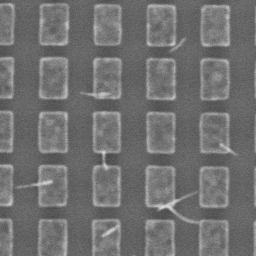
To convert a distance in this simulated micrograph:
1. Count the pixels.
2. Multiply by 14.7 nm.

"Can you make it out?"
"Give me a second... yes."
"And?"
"wiring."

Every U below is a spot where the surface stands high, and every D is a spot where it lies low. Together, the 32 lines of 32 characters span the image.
UDDDDDDUDDDDDDDDDDDDDDDDDDDDDDDD
UUDDDUUUDDDDUUUDDDUUUUDDDUUUUDDD
UUDDDUUUDDDDUUUDDDDUUUDDDUUUUDDD
UUDDDUUUDDDDUUUDDDDUUUDDDUUUUDDD
UUDDDUUUDDDDUUUDDDUUUUDDDUUUUDDD
UDDDDUUUDDDDUUUDDDDUUUDDDUUUDDDD
DDDDDDDDDDDDDDDDDDDDDDDDDDDDDDDD
UUDDDUUUDDDDUUUDDDDUUUDDDUUUDDDD
UUDDDUUUDDDDUUUDDDUUUUDDDUUUUDDD
UUDDDUUUDDDDUUUDDDUUUUDDDUUUUDDD
UUDDDUUUDDDDUUUDDDUUUUDDDUUUUDDD
UUDDDUUUDDDDUUUDDDUUUUDDDUUUUDDD
DDDDDDDDDDDDDDDDDDDDDDDDDDDDDDDD
DDDDDDDDDDDDDDDDDDDDDDDDDDDDDDDD
UUDDDUUUDDDDUUUDDDUUUUDDDUUUUDDD
UUDDDUUUDDDDUUUDDDUUUUDDDUUUUDDD
UUDDDUUUDDDDUUUDDDUUUUDDDUUUUDDD
UUDDDUUUDDDDUUUDDDUUUUDDDUUUUDDD
UUDDDUUUDDDDUUUDDDUUUUDDDUUUUDDD
DDDDDDDDDDDDDDDDDDDDDDDDDDDDDDDD
DDDDDDDDDDDDDDDDDDDDDDDDDDDDDDDD
UUDDDUUUDDDDUUUDDDUUUUDDDUUUUDDD
UUDDDUUUDDDDUUUDDDUUUUDDDUUUUDDD
UUDDDUUUDDDDUUUDDDUUUUDDDUUUUDDD
UUDDDUUUDDDDUUUDDDUUUUDDDUUUDDDD
UDDDDUUUDDDDUUUDDDUUUUDDDUUUDDDD
DDDDDDDDDDDDDDDDDDDDDDDDDDDDDDDD
UDDDDUUUDDDDDUUDDDDDDDDDDDDDDDDD
UDDDDUUUDDDDUUUDDDUUUUDDDUUUDDDD
UUDDDUUUDDDDUUUDDDUUUUDDDUUUDDDD
UUDDDUUUDDDDUUUDDDUUUUDDDUUUDDDD
UDDDDUUUDDDDUUUDDDUUUUDDDUUUDDDD